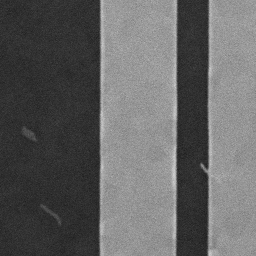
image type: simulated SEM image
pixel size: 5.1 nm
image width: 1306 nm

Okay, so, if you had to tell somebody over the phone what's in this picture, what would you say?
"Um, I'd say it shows wiring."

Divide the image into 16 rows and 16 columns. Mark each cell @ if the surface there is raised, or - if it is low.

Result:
------@@@@@--@@@
------@@@@@--@@@
------@@@@@--@@@
------@@@@@--@@@
------@@@@@--@@@
------@@@@@--@@@
------@@@@@--@@@
------@@@@@--@@@
------@@@@@--@@@
------@@@@@--@@@
------@@@@@--@@@
------@@@@@--@@@
------@@@@@--@@@
------@@@@@--@@@
------@@@@@--@@@
------@@@@@--@@@